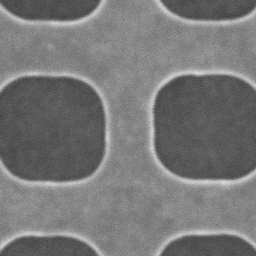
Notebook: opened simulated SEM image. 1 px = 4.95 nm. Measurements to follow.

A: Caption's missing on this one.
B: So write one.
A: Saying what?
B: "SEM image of holes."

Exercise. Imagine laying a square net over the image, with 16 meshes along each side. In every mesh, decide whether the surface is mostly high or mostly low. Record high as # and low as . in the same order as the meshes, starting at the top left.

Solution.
......####......
################
################
################
################
......####......
......####......
.......###......
.......###......
.......###......
......####......
################
################
################
################
......####......